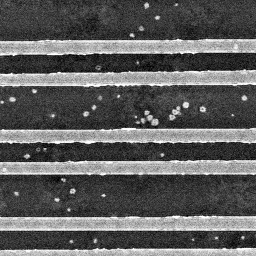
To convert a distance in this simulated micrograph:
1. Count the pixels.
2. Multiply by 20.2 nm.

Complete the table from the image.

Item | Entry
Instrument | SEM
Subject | lines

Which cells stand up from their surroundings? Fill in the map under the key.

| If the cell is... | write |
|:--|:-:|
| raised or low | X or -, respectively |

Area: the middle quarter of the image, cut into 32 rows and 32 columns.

--------------------------------
--------------------------------
XXXXXXXXXXXXXXXXXXXXXXXXXXXXXXXX
XXXXXXXXXXXXXXXXXXXXXXXXXXXXXXXX
XXXXXXXXXXXXXXXXXXXXXXXXXXXXXXXX
--------------------------------
--------------------------------
--------------------------------
--------------------------------
--------------------------------
--------------------------------
--------------------------------
--------------------------------
--------------------------------
--------------------------------
--------------------------------
---------X-XXXXXXXXXXXXXXXXXXXXX
XXXXXXXXXXXXXXXXXXXXXXXXXXXXXXXX
XXXXXXXXXXXXXXXXXXXXXXXXXXXXXXXX
XXX-XXXX-XXXX-XXXXXXX-XXXXXXXXXX
--------------------------------
--------------------------------
--------------------------------
--------------------------------
--------------------------XXX-XX
XXXXXXXXXXXXXXXXXXXXXXXXXXXXXXXX
XXXXXXXXXXXXXXXXXXXXXXXXXXXXXXXX
------X--X---------X---------X--
--------------------------------
--------------------------------
--------------------------------
--------------------------------